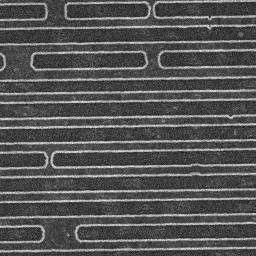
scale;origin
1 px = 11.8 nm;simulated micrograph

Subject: parallel lines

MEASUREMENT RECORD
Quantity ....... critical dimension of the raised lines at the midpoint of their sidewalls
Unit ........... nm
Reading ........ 113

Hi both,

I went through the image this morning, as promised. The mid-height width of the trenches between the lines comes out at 184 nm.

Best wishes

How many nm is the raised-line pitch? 290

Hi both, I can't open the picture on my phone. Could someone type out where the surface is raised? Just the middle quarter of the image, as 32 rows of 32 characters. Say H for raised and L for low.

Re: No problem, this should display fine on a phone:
LLLLLLLLLLLLLLLLLLLLHHHHLLLLLLLL
HHHHHHHHHHHHHHHHHHHHHHHHHHHHHHHH
HHHHHHHHHHHHHHHHHHHHHHHHHHHHHHHH
HHHHHHHHHHHHHHHHHHHHHHHHLLLLLLLL
LLLLLLLLLLLLLLLLLLLLLLLLLLLLLLLL
LLLLLLLLLLLLLLLLLLLLLLLLLLLLLLLL
LLLLLLLLLLLLLLLLLLLLLLLLLLLLLLLL
HHHHHHHHHHHHHHHHHHHHHHHHHHHHHHHH
HHHHHHHHHHHHHHHHHHHHHHHHHHHHHHHH
LLLLLLLLLLLLLLLLLLLLLLLLLLLLLLLL
LLLLLLLLLLLLLLLLLLLLLLLLLLLLLLLL
LLLLLLLLLLLLLLLLLLLLLLLLLLLLLLLL
LLLLLLLLLLLLLLLLLLLLLLLLLLLLLLLL
LLLLLLLLLLLHHHHHHHHHHHHHHHHHHHHH
HHHHHHHHHHHHHHHHHHHHHHHHHHHHHHHH
HHHHHHHHHLLLLHHHHHHHLLLLLLLLLLLL
LLLLLLLLLLLLLLLLLLLLLLLLLLLLLLLL
LLLLLLLLLLLLLLLLLLLLLLLLLLLLLLLL
LLLLLLLLLLLLLLLLLLLLLLLLLLLLLLLL
LLLLLLLLLLLLLLLLLLHHHHHHHHHHHHHH
HHHHHHHHHHHHHHHHHHHHHHHHHHHHHHHH
HHHHHHHHHHHHHHHHHHHHHHHHHHHHHLLL
LLLLLLLLLLLLLLLLLLLLLLLLLLLLLLLL
LLLLLLLLLLLLLLLLLLLLLLLLLLLLLLLL
LLLLLLLLLLLLLLLLLLLLLLLLLLLLLLLL
LLLLLLLLLLLLLLLLLLLLLLLLLHHHHHHH
HHHHHHHHHHHHHHHHHHHHHHHHHHHHHHHH
HHHHHHHHHHHHHHHHHHHHHHHHHHHHHHHH
LLLLLLLLLLLLLLLLLLLLLLLLLLLLLLLL
LLLLLLLLLLLLLLLLLLLLLLLLLLLLLLLL
LLLLLLLLLLLLLLLLLLLLLLLLLLLLLLLL
LLLLLLLLLLLLLLLLLLLLLLLLLLLLLLLL